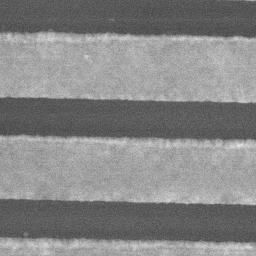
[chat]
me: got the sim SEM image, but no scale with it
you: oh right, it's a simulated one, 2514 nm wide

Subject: lines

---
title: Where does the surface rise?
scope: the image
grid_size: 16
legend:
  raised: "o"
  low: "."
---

................
................
oooooooooooooooo
oooooooooooooooo
oooooooooooooooo
oooooooooooooooo
................
................
oo..............
oooooooooooooooo
oooooooooooooooo
oooooooooooooooo
.....ooooooooooo
................
................
oooooooooooooooo